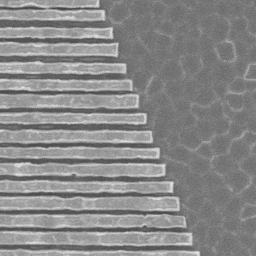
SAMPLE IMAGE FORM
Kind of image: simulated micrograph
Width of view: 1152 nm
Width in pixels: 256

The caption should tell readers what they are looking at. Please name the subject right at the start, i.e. parallel lines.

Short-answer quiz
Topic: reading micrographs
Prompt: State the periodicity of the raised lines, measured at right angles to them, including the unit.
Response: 0.0774 um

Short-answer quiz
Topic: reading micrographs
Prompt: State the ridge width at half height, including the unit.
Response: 49 nanometres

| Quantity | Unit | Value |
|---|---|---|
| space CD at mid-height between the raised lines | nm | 27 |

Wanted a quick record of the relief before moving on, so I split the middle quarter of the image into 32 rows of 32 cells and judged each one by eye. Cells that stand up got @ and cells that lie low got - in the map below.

@@@@@@@@@@@@@@@-----------------
@@@@@@@@@@@@@@@-----------------
--------------------------------
--------------------------------
@@@@@@@@@@@@@@@@@---------------
@@@@@@@@@@@@@@@@@---------------
-----@@@@-----------------------
--------------------------------
@@@@@@@@@@@@@@@@@@--------------
@@@@@@@@@@@@@@@@@@--------------
@@@@@@@@@-@@@@@@@@--------------
--------------------------------
@@-----------------@------------
@@@@@@@@@@@@@@@@@@@@@-----------
@@@@@@-@@@@@@@-@@@@@------------
--------------------------------
--------------------------------
@@@@@@@@@@@@@@@@@@@@@@----------
@@@@@@@@@@@@@@@@@@@@@@----------
--------------@@@@@@@@----------
--------------------------------
@@@@@@@@@@@@@@@@@@@@@@@@--------
@@@@@@@@@@@@@@@@@@@@@@@@--------
--------------------------------
--------------------------------
@@@@@@@@@@@@@@@@@@@@@@@@@-------
@@@@@@@@@@@@@@@@@@@@@@@@@-------
@--@@@@@@@@@@@@@@@@@@@@@@-------
--------------------------------
--------------------------------
@@@@@@@@@@@@@@@@@@@@@@@@@@@-----
@@@@@@@@@@@@@@@@@@@@@@@@@@@-----